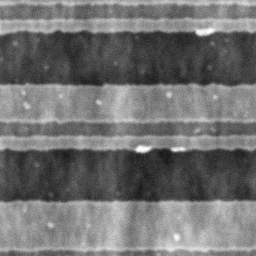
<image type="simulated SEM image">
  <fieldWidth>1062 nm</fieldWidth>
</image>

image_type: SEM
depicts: lines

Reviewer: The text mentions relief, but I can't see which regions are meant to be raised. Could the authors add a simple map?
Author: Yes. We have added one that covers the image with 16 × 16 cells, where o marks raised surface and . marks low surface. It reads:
oooooooooooooooo
oooooooooooooooo
................
................
................
oooooooooooooooo
oooooooooooooooo
oooooooooooooooo
oooooooooooooooo
................
................
................
................
oooooooooooooooo
oooooooooooooooo
oooooooooooooooo